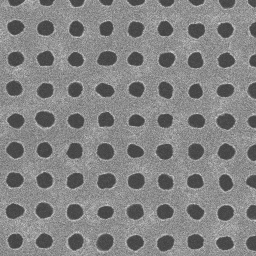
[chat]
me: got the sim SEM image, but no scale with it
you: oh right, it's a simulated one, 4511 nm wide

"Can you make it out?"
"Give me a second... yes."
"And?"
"a regular array of holes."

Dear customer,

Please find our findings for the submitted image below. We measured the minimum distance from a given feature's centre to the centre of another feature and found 519 nanometres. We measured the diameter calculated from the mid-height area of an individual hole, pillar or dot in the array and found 16 pixels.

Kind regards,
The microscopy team